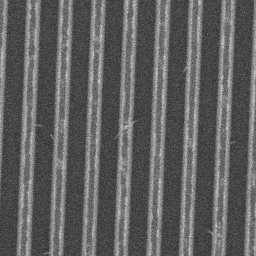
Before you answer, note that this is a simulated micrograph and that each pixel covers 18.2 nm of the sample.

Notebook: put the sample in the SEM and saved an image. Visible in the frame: parallel lines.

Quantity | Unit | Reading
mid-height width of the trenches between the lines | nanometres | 392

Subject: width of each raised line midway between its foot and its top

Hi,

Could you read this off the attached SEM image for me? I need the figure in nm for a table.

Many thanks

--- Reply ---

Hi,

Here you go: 189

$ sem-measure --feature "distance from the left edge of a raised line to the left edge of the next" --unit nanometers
593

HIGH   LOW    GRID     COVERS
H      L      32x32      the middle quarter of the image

HLLLLLLHHLLLLLLHHLLLLLLHHLLLLLLH
HLLLLLLHHLLLLLLHHLLLLLLHHLLLLLLH
HLLLLLLHHLLLLLLHHLLLLLLHHLLLLLLH
HLLLLLLHHLLLLLLHHLLLLLLHHLLLLLLH
HLLLLLLHHLLLLLLHHLLLLLLHHLLLLLLH
HLLLLLLHHLLLLLLHHLLLLLLHHLLLLLLH
HLLLLLHHHLLLLLLHHLLLLLLHHLLLLLLH
HLLLLLHHHLLLLLLHHLLLLLLHHLLLLLLH
HLLLLLHHHLLLLLLHHLLLLLLHHLLLLLLH
HLLLLLHHHLLLLLLHHLLLLLLHHLLLLLLH
HLLLLLHHHLLLLLLHHLLLLLHHHLLLLLLH
HLLLLLHHHLLLLLHHHLLLLLHHHLLLLLLH
HLLLLLHHHLLLLLHHHLLLLLLHHLLLLLLH
HLLLLLHHHLLLLLHHHLLLLLLHHLLLLLLH
HLLLLLHHHLLLLLHHHLLLLLLHHLLLLLLH
HLLLLLHHHLLLLLHHHLLLLLHHHLLLLLHH
LLLLLLHHHLLLLLHHHLLLLLHHHLLLLLHH
LLLLLLHHHLLLLLHHHLLLLLHHHLLLLLHH
LLLLLLHHHLLLLLHHHLLLLLHHHLLLLLHH
LLLLLLHHHLLLLLHHLLLLLLHHHLLLLLHH
LLLLLLHHHLLLLLHHLLLLLLHHHLLLLLHH
LLLLLLHHLLLLLLHHLLLLLLHHHLLLLLHH
LLLLLLHHLLLLLLHHLLLLLLHHHLLLLLHH
LLLLLLHHLLLLLLHHLLLLLLHHHLLLLLHH
LLLLLLHHLLLLLLHHLLLLLLHHLLLLLLHH
LLLLLLHHLLLLLLHHLLLLLLHHLLLLLLHH
LLLLLLHHLLLLLLHHLLLLLLHHLLLLLLHH
LLLLLLHHLLLLLLHHLLLLLLHHLLLLLLHH
LLLLLLHHLLLLLLHHLLLLLLHHLLLLLLHH
LLLLLLHHLLLLLLHHLLLLLLHHLLLLLLHH
LLLLLLHHLLLLLLHHLLLLLLHHLLLLLLHH
LLLLLHHHLLLLLLHHLLLLLLHHLLLLLLHH